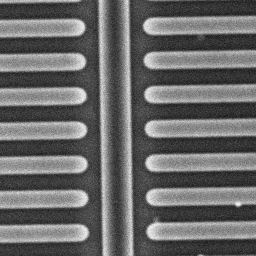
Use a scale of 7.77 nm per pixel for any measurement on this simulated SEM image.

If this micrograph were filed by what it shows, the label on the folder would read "groups of lines, slits or small figures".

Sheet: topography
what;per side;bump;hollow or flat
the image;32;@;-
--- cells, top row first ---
------------@@@@----------------
------------@@@@----------------
--------@@--@@@@--@@@@@@@@@@@@@@
@@@@@@@@@@@-@@@@--@@@@@@@@@@@@@@
@@@@@@@@@---@@@@----------------
------------@@@@----------------
------------@@@@------@@@@@@@@@@
@@@@@@@@@@@-@@@@--@@@@@@@@@@@@@@
@@@@@@@@@@---@@@---@@@@---------
-------------@@@----------------
-------------@@@----------------
@@@@@@@@@@@--@@@--@@@@@@@@@@@@@@
@@@@@@@@@@@--@@@--@@@@@@@@@@@@@@
-------------@@@----------------
-------------@@@----------------
@@@@@@@@@@---@@@--@@@@@@@@@@@@@@
@@@@@@@@@@@--@@@--@@@@@@@@@@@@@@
-------------@@@----------------
-------------@@@----------------
-------------@@@---@@@@@@@@@@@@@
@@@@@@@@@@@--@@@--@@@@@@@@@@@@@@
@@@@@@@@@@---@@@----------------
-------------@@@----------------
-------------@@@----------------
@@@@@@@@@@@--@@@--@@@@@@@@@@@@@@
@@@@@@@@@@@--@@@---@@@@@@@@--@@-
-------------@@@----------------
-------------@@@@---------------
@@@@@@@@@@@--@@@@--@@@@@@@@@@@@@
@@@@@@@@@@@--@@@@--@@@@@@@@@@@@@
-------------@@@@---------------
-------------@@@@---------------